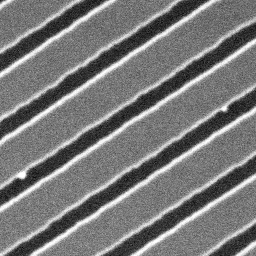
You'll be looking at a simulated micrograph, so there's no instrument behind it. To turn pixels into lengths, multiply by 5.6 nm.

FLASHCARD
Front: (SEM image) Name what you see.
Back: lines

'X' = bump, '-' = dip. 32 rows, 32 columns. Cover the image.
XXXXXXXXX----XXXXXXXXX----XXXXXX
XXXXXXXX---XXXXXXXXXX---XXXXXXXX
XXXXXX----XXXXXXXXX----XXXXXXXXX
XXXXX----XXXXXXXX----XXXXXXXXX--
XXX----XXXXXXXXX----XXXXXXXXX---
XX----XXXXXXXX----XXXXXXXXX----X
----XXXXXXXXX----XXXXXXXXX----XX
---XXXXXXXX----XXXXXXXXX----XXXX
-XXXXXXXXX----XXXXXXXXX----XXXXX
XXXXXXXX----XXXXXXXXX----XXXXXXX
XXXXXXX----XXXXXXXXX---XXXXXXXXX
XXXXX----XXXXXXXXX----XXXXXXXXX-
XXXX----XXXXXXXXX---XXXXXXXXX---
XX----XXXXXXXXX----XXXXXXXXX----
X----XXXXXXXXX---XXXXXXXXX----XX
---XXXXXXXXX----XXXXXXXXX----XXX
--XXXXXXXX----XXXXXXXXX----XXXXX
XXXXXXXXX----XXXXXXXXX----XXXXXX
XXXXXXXX---XXXXXXXXXX---XXXXXXXX
XXXXXX----XXXXXXXXX----XXXXXXXXX
XXXXX---XXXXXXXXXX---XXXXXXXXX--
XXX----XXXXXXXXX----XXXXXXXXX---
XX---XXXXXXXXX----XXXXXXXXX----X
----XXXXXXXXX----XXXXXXXXX---XXX
--XXXXXXXXX----XXXXXXXXX----XXXX
-XXXXXXXXX---XXXXXXXXX----XXXXXX
XXXXXXXX----XXXXXXXXX----XXXXXXX
XXXXXXX---XXXXXXXXX----XXXXXXXXX
XXXXXX---XXXXXXXXX----XXXXXXXXX-
XXXX---XXXXXXXXX----XXXXXXXXX---
XX----XXXXXXXXX----XXXXXXXXX---X
X---XXXXXXXXX----XXXXXXXXX----XX